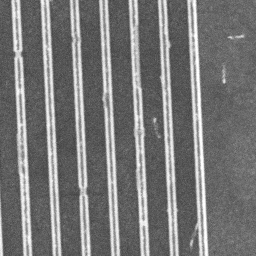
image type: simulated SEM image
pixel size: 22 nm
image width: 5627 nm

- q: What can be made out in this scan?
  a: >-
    parallel lines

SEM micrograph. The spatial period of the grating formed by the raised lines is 644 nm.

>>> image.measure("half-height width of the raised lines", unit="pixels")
5.99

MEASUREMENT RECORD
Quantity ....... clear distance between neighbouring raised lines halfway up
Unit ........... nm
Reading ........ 513